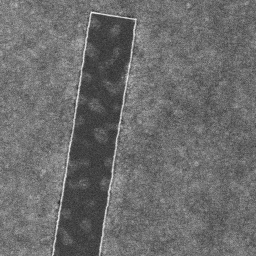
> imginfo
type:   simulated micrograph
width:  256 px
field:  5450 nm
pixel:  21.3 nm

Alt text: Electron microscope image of one or a few lines or trenches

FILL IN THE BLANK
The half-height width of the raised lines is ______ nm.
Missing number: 988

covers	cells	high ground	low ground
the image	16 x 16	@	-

----------------
------@@--------
-----@@@--------
-----@@@--------
-----@@@--------
-----@@@--------
-----@@@--------
-----@@@--------
----@@@---------
----@@@---------
----@@@---------
----@@@---------
----@@@---------
----@@@---------
----@@----------
---@@@----------